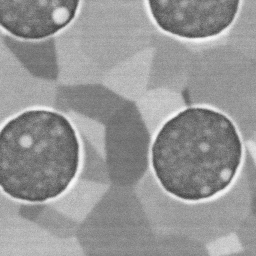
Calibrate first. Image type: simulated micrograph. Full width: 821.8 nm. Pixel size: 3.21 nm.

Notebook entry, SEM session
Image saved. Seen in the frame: holes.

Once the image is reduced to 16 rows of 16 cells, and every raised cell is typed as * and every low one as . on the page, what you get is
.....****......*
....******....**
****************
****************
****************
****************
****************
*...*******...**
.....*****.....*
.....*****.....*
.....*****.....*
....******....**
*..*************
****************
****************
****************